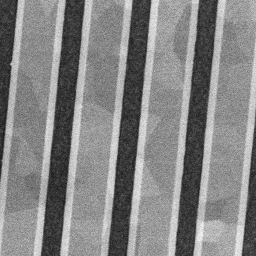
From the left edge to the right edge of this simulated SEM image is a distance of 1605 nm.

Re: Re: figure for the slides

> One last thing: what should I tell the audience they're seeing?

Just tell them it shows one or a few lines or trenches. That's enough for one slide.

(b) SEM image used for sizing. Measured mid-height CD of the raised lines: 258 nm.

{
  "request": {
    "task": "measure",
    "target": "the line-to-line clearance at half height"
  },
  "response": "164 nanometres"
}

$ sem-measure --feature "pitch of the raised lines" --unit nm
418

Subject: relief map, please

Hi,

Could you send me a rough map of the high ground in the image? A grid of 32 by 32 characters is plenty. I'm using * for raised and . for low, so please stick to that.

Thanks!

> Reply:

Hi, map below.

...*****...*****...*****....****
..******...*****...*****...*****
..******...*****...*****....****
..*****....*****...*****...*****
..*****....*****...*****...*****
..*****....*****...*****...*****
..*****...******...*****...*****
..*****...*****....*****...*****
..*****...*****....*****...*****
..*****...*****...******...*****
..*****...*****...******...*****
..*****...*****...*****....*****
.******...*****...*****....*****
.*****....*****...*****...******
.*****....*****...*****...*****.
.*****....*****...*****...*****.
.*****...******...*****...*****.
.*****...*****....*****...*****.
.*****...*****....*****...*****.
.*****...*****....*****...*****.
.*****...*****...******...*****.
.*****...*****...*****....*****.
******...*****...*****...******.
*****....*****...*****...******.
*****....*****...*****...*****..
*****....*****...*****...*****..
*****....*****...*****...*****..
*****...******...*****...*****..
*****...*****....*****...*****..
*****...*****...******...*****..
*****...*****...******...*****..
*****...*****...*****....*****..